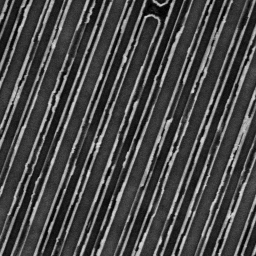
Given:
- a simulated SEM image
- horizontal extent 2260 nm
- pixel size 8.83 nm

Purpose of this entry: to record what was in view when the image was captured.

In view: parallel lines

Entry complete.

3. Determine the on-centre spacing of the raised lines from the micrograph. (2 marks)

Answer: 166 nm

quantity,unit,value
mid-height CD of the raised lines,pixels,8.45